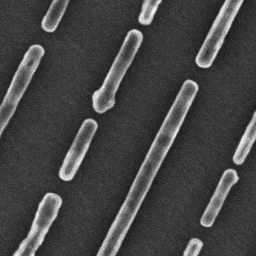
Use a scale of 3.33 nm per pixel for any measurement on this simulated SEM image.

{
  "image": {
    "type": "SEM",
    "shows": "one or a few lines or trenches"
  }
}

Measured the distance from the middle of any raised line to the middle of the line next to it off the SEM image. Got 0.25 um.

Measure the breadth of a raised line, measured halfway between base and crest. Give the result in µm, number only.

0.0498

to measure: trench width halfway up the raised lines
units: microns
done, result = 0.203